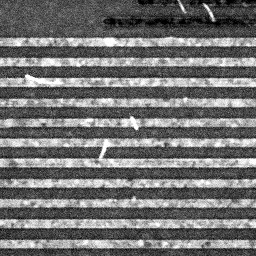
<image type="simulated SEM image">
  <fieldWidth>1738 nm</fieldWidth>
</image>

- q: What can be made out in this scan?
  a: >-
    parallel lines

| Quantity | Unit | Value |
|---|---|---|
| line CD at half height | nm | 51.8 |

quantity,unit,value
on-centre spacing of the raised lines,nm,137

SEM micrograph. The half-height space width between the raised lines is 84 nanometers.